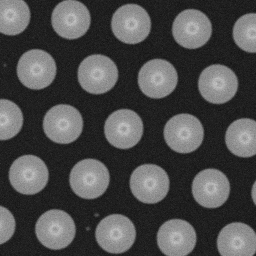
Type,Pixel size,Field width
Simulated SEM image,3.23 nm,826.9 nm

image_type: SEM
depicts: an array of small figures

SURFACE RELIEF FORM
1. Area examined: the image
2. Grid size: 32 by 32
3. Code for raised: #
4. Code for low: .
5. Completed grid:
###....###......................
####...####...####.....##.......
####..#####...#####...####....##
###....####...#####...####...###
........##....####....####...###
......................####....##
...###.........................#
..#####...####.....#............
..#####...#####...####....###...
..#####...#####..#####...####...
...###....####...#####...#####..
...........##.....###....####...
#.........................###...
##.....##.......................
###...####....###.....##........
###..#####...#####...####....###
##....####...#####..#####...####
......###....####....####...####
...............#.....####....###
...#..........................#.
..####....###...................
.#####...####....####....###....
.#####...#####..#####...####....
..###....####...#####...#####...
..........##.....####...#####...
.........................###....
#.....##........................
##...####....###.....##.........
##..#####...#####...####....###.
#....####...#####...####...#####
.....####...#####...####...#####
.............##.....####...#####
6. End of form